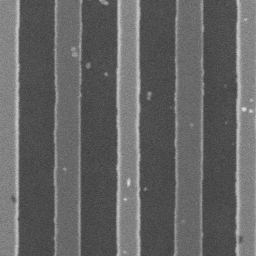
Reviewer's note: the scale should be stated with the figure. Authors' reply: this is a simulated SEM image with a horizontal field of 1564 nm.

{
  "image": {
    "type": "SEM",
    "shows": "lines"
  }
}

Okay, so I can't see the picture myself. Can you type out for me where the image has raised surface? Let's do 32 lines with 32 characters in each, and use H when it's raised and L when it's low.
HHLLLLLHHHLLLLLHHLLLLLHHHLLLLLHH
HHLLLLLHHHLLLLLHHLLLLLHHHLLLLLHH
HHLLLLLHHHLLLLLHHLLLLLHHHLLLLLHH
HHLLLLLHHHLLLLLHHLLLLLHHHLLLLLHH
HHLLLLLHHHLLLLLHHLLLLLHHHLLLLLHH
HHLLLLLHHHLLLLLHHLLLLLHHHLLLLLHH
HHLLLLLHHHLLLLLHHLLLLLHHHLLLLLHH
HHLLLLLHHHLLLLLHHLLLLLHHHLLLLLHH
HHLLLLLHHHLLLLLHHLLLLLHHHLLLLLHH
HHLLLLLHHHLLLLLHHLLLLLHHHLLLLLHH
HHLLLLLHHHLLLLLHHLLLLLHHHLLLLLHH
HHLLLLLHHHLLLLLHHLLLLLHHHLLLLLHH
HHLLLLLHHHLLLLLHHLLLLLHHHLLLLLHH
HHLLLLLHHHLLLLLHHLLLLLHHHLLLLLHH
HHLLLLLHHHLLLLLHHLLLLLHHHLLLLLHH
HHLLLLLHHHLLLLLHHLLLLLHHHLLLLLHH
HHLLLLLHHHLLLLLHHLLLLLHHHLLLLLHH
HHLLLLLHHHLLLLLHHLLLLLHHHLLLLLHH
HHLLLLLHHHLLLLLHHLLLLLHHHLLLLLHH
HHLLLLLHHHLLLLLHHLLLLLHHHLLLLLHH
HHLLLLLHHHLLLLLHHLLLLLHHHLLLLLHH
HHLLLLLHHHLLLLLHHLLLLLHHHLLLLLHH
HHLLLLLHHHLLLLLHHLLLLLHHHLLLLLHH
HHLLLLLHHHLLLLLHHLLLLLHHHLLLLLHH
HHLLLLLHHHLLLLLHHLLLLLHHHLLLLLHH
HHLLLLLHHHLLLLLHHLLLLLHHHLLLLLHH
HHLLLLLHHHLLLLLHHLLLLLHHHLLLLLHH
HHLLLLLHHHLLLLLHHLLLLLHHHLLLLLHH
HHLLLLLHHHLLLLLHHLLLLLHHHLLLLLHH
HHLLLLLHHHLLLLLHHLLLLLHHHLLLLLHH
HHLLLLLHHHLLLLLHHLLLLLHHHLLLLLHH
HHLLLLLHHHLLLLLHHLLLLLHHHLLLLLHH